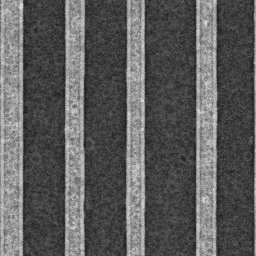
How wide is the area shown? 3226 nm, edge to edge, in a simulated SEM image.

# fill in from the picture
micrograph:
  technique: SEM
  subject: one or a few lines or trenches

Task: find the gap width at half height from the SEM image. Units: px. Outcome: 46.5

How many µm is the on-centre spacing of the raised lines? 0.819